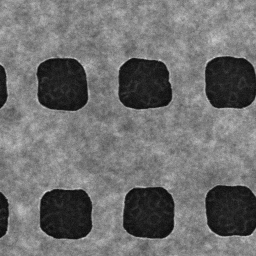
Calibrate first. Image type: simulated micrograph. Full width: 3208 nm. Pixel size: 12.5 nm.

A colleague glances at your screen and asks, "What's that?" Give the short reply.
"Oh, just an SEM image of holes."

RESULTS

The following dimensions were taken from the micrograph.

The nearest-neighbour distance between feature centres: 1030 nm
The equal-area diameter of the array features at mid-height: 690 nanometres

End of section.